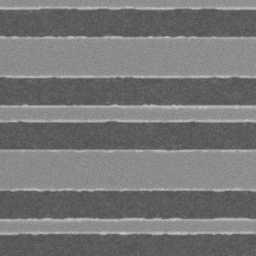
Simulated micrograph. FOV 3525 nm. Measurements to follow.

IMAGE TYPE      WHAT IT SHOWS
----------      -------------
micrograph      lines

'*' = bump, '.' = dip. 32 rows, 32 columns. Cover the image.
********************************
................................
................................
................................
................................
********************************
********************************
********************************
********************************
********************************
................................
................................
................................
********************************
********************************
................................
................................
................................
................................
********************************
********************************
********************************
********************************
********************************
................................
................................
................................
********************************
********************************
................................
................................
................................